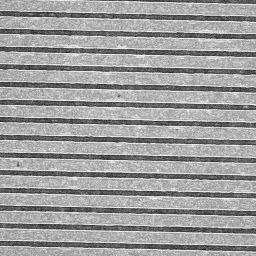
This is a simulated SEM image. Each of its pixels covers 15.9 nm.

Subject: parallel lines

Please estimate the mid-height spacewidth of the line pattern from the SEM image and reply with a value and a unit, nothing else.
101 nm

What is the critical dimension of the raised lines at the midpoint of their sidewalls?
11.5 px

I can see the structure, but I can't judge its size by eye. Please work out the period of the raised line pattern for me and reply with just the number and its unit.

0.28 µm